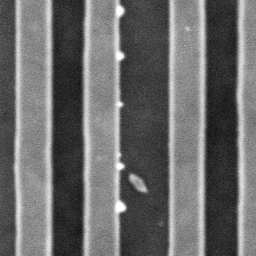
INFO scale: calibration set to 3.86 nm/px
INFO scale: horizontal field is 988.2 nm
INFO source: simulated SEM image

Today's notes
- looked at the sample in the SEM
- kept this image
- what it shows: lines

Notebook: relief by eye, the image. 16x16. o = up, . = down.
.oo..ooo...oo..o
.oo..oo....oo..o
.oo..oo....oo..o
.oo..ooo...oo..o
.oo..oo....oo..o
.oo..oo....oo..o
.oo..oo....oo..o
.oo..oo....oo..o
.oo..oo....oo..o
.oo..oo....oo..o
.oo..ooo...oo..o
.oo..oo....oo..o
.oo..ooo...oo..o
.oo..oo....oo..o
.oo..oo....oo..o
.oo..oo....oo..o